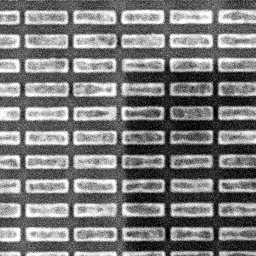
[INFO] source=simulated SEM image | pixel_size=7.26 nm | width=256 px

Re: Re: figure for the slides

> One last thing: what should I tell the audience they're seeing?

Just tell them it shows wiring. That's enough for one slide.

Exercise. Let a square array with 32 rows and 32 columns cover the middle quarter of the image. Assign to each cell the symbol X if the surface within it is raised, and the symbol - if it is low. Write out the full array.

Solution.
X--XXXXXXXXXX--XXXXXXXXXX--XXXXX
---XXXXXXXXX----------XXX--XXXX-
--------------------------------
--------------------------------
--------------------------------
X-XXXXXXXXXXX--XXXXXXXXXX--XXXXX
X--XXXXXXXXXX--XXXXXXXXXX--XXXXX
X--XXXXXXXXX-------XXXXXX--XXXXX
--------------------------------
--------------------------------
--------------------------------
X--XXXXXXXXX---XXXXXXXXXX--XXXXX
X--XXXXXXXXX---XXXXXXXXXX--XXXXX
---XXXXXXX-----XXX--XXXX---XXXXX
--------------------------------
--------------------------------
--------------------------------
X--XXXXXXXXXX--XXXXXXXXXX--XXXXX
X--XXXXXXXXXX--XXXXXXXXXX--XXXXX
X--XXXXXXXXXX--XXXXXXXXXX--XX--X
--------------------------------
--------------------------------
--------------------------------
X--XXXXXXXXXX--XXXXXXXXXX--XXXXX
X--XXXXXXXXXX--XXXXXXXXXX--XXXXX
X-------XXXX---XXXXX---X---XXXXX
--------------------------------
--------------------------------
--------------------------------
X--XXXXXXXXX---XXXXXXXXXX--XXXXX
X--XXXXXXXXXX--XXXXXXXXXX--XXXXX
X--XXXXXXXXXX--XXXXXXXXXX--XXXXX